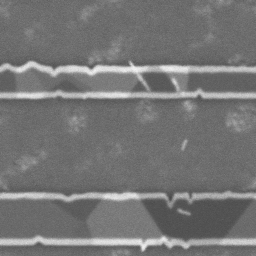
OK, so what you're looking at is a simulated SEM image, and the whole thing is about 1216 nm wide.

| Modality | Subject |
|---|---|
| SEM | one or a few lines or trenches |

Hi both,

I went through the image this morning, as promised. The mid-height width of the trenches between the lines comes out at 0.476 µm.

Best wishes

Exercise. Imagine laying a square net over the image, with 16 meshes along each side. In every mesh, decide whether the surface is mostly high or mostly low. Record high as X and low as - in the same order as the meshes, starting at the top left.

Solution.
----------------
----------------
----------------
----------------
XXXXXXXXXXXXXXXX
XXXXXXXXXXXXXXXX
----------------
----------------
----------------
----------------
----------------
----------------
XXXXXXXXXXXXXXXX
XXXXXXXXXXXXXXXX
XXXXXXXXXXXXXXXX
----------------